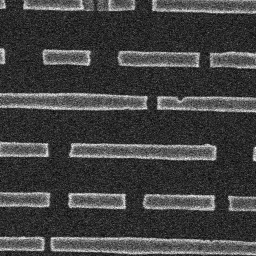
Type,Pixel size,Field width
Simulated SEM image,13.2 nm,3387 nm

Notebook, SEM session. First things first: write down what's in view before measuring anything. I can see parallel lines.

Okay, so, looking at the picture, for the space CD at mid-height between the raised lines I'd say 474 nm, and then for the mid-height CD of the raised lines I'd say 179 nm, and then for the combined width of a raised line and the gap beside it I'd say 624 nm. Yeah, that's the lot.